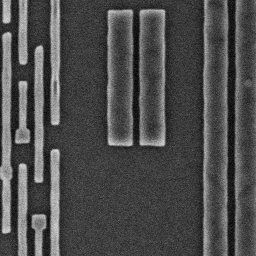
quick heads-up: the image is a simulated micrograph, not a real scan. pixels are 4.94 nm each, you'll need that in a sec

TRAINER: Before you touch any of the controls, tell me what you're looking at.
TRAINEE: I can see wiring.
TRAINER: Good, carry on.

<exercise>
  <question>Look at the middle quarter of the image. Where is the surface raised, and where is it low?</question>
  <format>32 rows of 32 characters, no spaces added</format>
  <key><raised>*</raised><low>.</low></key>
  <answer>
...........******..******.......
...........******..******.......
...........******..******.......
...........******..******.......
...........******..******.......
...........******..******.......
...........******..******.......
...........******..******.......
...........******..******.......
...........******..******.......
...........******..******.......
...........******..******.......
...........******..******.......
...........******..******.......
...........******..******.......
...........******..******.......
...........******..******.......
...........******..******.......
...........******..******.......
...........******..******.......
................................
................................
................................
................................
................................
................................
................................
................................
................................
................................
................................
................................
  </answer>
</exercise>